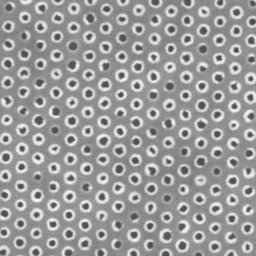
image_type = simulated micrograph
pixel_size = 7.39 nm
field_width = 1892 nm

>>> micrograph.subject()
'a regular array of holes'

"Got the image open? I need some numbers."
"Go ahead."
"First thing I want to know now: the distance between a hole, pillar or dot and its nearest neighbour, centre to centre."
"18.2 px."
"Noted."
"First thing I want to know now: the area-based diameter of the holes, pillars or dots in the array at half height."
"49.4 nanometres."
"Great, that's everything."